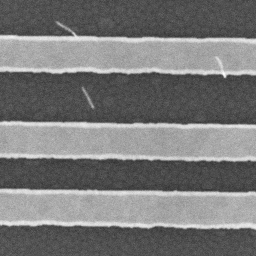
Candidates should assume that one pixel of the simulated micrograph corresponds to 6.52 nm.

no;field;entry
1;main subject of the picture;lines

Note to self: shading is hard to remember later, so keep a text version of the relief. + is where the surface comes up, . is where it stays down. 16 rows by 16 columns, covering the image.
................
................
++++++++++++....
++++++++++++++++
..........++++++
................
................
................
++++++++++++++++
++++++++++++++++
................
................
++++++++++++++++
++++++++++++++++
................
................